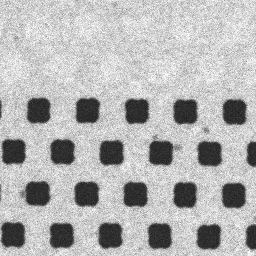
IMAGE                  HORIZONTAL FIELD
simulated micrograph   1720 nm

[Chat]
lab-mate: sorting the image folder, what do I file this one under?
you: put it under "a regular array of holes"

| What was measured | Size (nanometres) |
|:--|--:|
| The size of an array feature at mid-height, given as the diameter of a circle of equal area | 175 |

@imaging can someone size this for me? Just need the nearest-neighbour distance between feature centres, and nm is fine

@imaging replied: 323